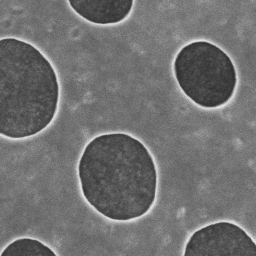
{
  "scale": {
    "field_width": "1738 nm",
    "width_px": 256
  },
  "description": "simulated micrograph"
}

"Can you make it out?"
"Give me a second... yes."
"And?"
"holes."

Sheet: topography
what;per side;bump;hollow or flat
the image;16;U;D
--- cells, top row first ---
UUUUUDDDUUUUUUUU
UUUUUUUUUUUUUUUU
DUUUUUUUUUUUUUUU
DDDUUUUUUUUDDDUU
DDDUUUUUUUUDDDDU
DDDDUUUUUUUDDDDU
DDDDUUUUUUUUDDUU
DDDUUUUUUUUUUUUU
DDUUUUDDUUUUUUUU
UUUUUDDDDUUUUUUU
UUUUUDDDDDUUUUUU
UUUUUDDDDDUUUUUU
UUUUUDDDDDUUUUUU
UUUUUUUDDUUUUUUU
UUUUUUUUUUUUDDDU
DDDUUUUUUUUUDDDD